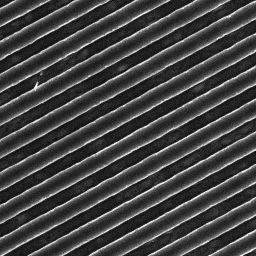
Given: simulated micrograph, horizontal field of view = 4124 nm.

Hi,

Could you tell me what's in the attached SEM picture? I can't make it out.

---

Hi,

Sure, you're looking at parallel lines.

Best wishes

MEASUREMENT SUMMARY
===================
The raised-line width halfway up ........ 265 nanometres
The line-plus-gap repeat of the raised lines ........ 464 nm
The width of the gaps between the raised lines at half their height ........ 12.2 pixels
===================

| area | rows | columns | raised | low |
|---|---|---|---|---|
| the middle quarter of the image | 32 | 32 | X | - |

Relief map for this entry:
---XXXXXXXX-------XXXXXXXX------
-XXXXXXXX-------XXXXXXXX-------X
XXXXXXXX------XXXXXXXXX------XXX
XXXXXX------XXXXXXXXX------XXXXX
XXXX-------XXXXXXXX-------XXXXXX
XX-------XXXXXXXX-------XXXXXXXX
-------XXXXXXXX------XXXXXXXXX--
-----XXXXXXXX-------XXXXXXXX----
---XXXXXXXXX------XXXXXXXXX-----
-XXXXXXXXX------XXXXXXXXX------X
XXXXXXXX-------XXXXXXXX-------XX
XXXXXX-------XXXXXXXX-------XXXX
XXXX-------XXXXXXXX-------XXXXXX
XX-------XXXXXXXX-------XXXXXXXX
X------XXXXXXXXX------XXXXXXXXX-
-----XXXXXXXXX------XXXXXXXXX---
----XXXXXXXX-------XXXXXXXX-----
--XXXXXXXX-------XXXXXXXX-------
XXXXXXXX-------XXXXXXXXX------XX
XXXXXX-------XXXXXXXX-------XXXX
XXXXX------XXXXXXXXX------XXXXXX
XXX-------XXXXXXXX------XXXXXXXX
X-------XXXXXXXX-------XXXXXXXX-
------XXXXXXXX-------XXXXXXXX---
----XXXXXXXX-------XXXXXXXX-----
--XXXXXXXX-------XXXXXXXX-------
XXXXXXXXX------XXXXXXXXX------XX
XXXXXXX-------XXXXXXXX------XXXX
XXXXX-------XXXXXXXX-------XXXXX
XXX-------XXXXXXXX-------XXXXXXX
X-------XXXXXXXX-------XXXXXXXX-
------XXXXXXXX-------XXXXXXXX---